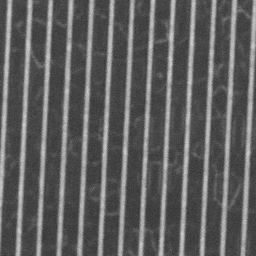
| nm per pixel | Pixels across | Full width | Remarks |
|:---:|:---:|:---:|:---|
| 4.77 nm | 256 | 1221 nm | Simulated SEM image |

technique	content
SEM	parallel lines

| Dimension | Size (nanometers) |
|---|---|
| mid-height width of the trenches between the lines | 79.9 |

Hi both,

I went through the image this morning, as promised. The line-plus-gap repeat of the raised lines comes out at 97.5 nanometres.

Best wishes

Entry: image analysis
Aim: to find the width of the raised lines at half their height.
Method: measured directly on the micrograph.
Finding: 17.3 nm